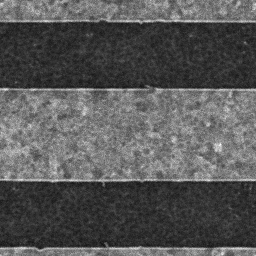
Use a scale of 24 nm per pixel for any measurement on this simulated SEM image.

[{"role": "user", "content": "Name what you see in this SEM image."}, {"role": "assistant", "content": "one or a few lines or trenches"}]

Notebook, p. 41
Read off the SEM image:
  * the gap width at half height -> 1650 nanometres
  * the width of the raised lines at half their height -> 2170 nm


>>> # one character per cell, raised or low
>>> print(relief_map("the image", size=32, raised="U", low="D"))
UUUUUUUUUUUUUUUUUUUUUUUUUUUUUUUU
UUUUUUUUUUUUUUUUUUUUUUUUUUUUUUUU
UUUUUUUUUUUUDUUUUUUUUUUUUUUUUUUU
DDDDDDDDDDDDDDDDDDDDDDDDDDDDDDDD
DDDDDDDDDDDDDDDDDDDDDDDDDDDDDDDD
DDDDDDDDDDDDDDDDDDDDDDDDDDDDDDDD
DDDDDDDDDDDDDDDDDDDDDDDDDDDDDDDD
DDDDDDDDDDDDDDDDDDDDDDDDDDDDDDDD
DDDDDDDDDDDDDDDDDDDDDDDDDDDDDDDD
DDDDDDDDDDDDDDDDDDDDDDDDDDDDDDDD
DDDDDDDDDDDDDDDDDDDDDDDDDDDDDDDD
UUUUUUUUUUUUUUUUUUUUUUUUUUUUUUUU
UUUUUUUUUUUUUUUUUUUUUUUUUUUUUUUU
UUUUUUUUUUUUUUUUUUUUUUUUUUUUUUUU
UUUUUUUUUUUUUUUUUUUUUUUUUUUUUUUU
UUUUUUUUUUUUUUUUUUUUUUUUUUUUUUUU
UUUUUUUUUUUUUUUUUUUUUUUUUUUUUUUU
UUUUUUUUUUUUUUUUUUUUUUUUUUUUUUUU
UUUUUUUUUUUUUUUUUUUUUUUUUUUUUUUU
UUUUUUUUUUUUUUUUUUUUUUUUUUUUUUUU
UUUUUUUUUUUUUUUUUUUUUUUUUUUUUUUU
UUUUUUUUUUUUUUUUUUUUUUUUUUUUUUUU
DDDUUUUUUUUUUUUDDUDDDDDDDDDDDDDD
DDDDDDDDDDDDDDDDDDDDDDDDDDDDDDDD
DDDDDDDDDDDDDDDDDDDDDDDDDDDDDDDD
DDDDDDDDDDDDDDDDDDDDDDDDDDDDDDDD
DDDDDDDDDDDDDDDDDDDDDDDDDDDDDDDD
DDDDDDDDDDDDDDDDDDDDDDDDDDDDDDDD
DDDDDDDDDDDDDDDDDDDDDDDDDDDDDDDD
DDDDDDDDDDDDDDDDDDDDDDDDDDDDDDDD
DDDDDDDDDDDDDDDDDDDDDDDDDDDDDDDD
UUUUUUUUUUUUUUUUUUUUUUUUUUUUUUUU